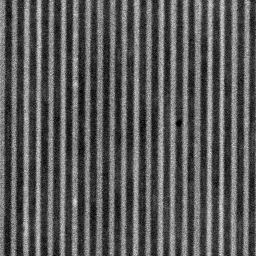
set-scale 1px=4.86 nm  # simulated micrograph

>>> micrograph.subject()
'parallel lines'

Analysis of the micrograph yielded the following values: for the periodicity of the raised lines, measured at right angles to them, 59.4 nm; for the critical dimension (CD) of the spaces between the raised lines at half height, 0.0401 um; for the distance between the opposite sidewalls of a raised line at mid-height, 17.6 nanometres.